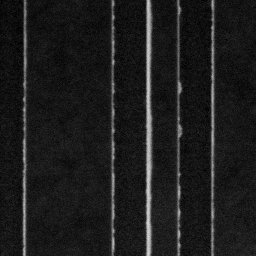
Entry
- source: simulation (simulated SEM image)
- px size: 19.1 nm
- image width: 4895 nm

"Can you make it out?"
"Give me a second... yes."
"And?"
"lines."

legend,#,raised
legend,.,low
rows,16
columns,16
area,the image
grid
..#####..##..###
..#####..##..###
..#####..##..###
..#####..##..###
..#####..##..###
..#####..##..###
..#####..##..###
..#####..##..###
..#####..##..###
..#####..##..###
..#####..##..###
..#####..##..###
..#####..##..###
..#####..##..###
..#####..##..###
..#####..##..###